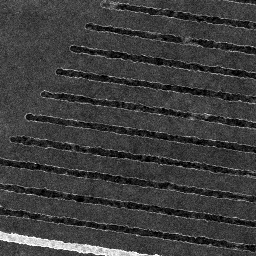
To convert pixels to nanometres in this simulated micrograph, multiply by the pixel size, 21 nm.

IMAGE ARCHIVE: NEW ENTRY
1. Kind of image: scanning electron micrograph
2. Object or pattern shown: parallel lines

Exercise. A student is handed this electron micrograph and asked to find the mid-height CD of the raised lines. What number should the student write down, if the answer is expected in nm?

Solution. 151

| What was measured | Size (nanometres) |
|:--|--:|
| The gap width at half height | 369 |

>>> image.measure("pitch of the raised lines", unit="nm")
515